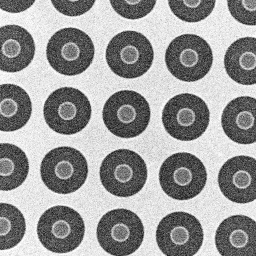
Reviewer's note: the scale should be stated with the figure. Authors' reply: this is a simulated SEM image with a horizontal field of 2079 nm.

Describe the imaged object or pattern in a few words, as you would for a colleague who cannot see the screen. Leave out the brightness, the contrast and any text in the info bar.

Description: an array of small figures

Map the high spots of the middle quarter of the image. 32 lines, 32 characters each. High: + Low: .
......+++++...........++++....++
.....+++++++.........+++++......
....+++++++++.......+++++++.....
+++++++++++++++...++++++++++....
++++++++++++++++++++++++++++++..
++++++++++++++++++++++++++++++++
....++++++++++...+++++++++++++++
.....+++++++.......++++++++++...
......+++++.........+++++++.....
.......+++...........+++++......
+++....+++.....++....++++.......
+++....+++....+++.....+++....+++
+++....++.....++++....++....++++
++.....+++....+++.....++....++++
......++++.....+.....++++....+++
......++++...........++++.......
.....++++++.........+++++.......
...+++++++++.......+++++++......
++++++++++++++...++++++++++.....
++++++++++++++++++++++++++++++.+
.+++++++++++++++++++++++++++++++
....+++++++++....+++++++++++++++
.....++++++........++++++++.....
.....+++++..........++++++......
+.....+++...........+++++.......
++....+++.....++.....+++........
++....+++....++++....+++....+++.
++....+++....++++....++.....++++
+.....+++....++++....+++....++++
.....++++............+++....+++.
.....+++++..........++++........
...+++++++.........++++++.......